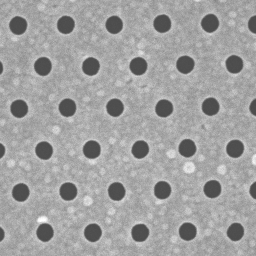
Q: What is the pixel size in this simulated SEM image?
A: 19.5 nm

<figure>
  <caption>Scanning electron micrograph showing a regular array of holes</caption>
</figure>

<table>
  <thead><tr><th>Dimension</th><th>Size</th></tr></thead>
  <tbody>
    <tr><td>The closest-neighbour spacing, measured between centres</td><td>47.1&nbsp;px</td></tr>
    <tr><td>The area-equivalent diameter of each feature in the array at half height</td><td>364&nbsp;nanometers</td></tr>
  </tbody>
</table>